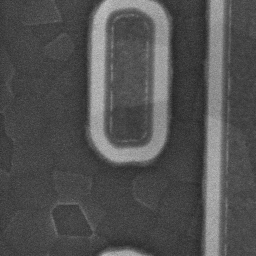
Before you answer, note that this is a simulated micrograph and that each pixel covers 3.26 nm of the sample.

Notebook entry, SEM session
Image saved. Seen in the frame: one or a few lines or trenches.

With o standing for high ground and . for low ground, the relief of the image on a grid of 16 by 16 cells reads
.......oo.....oo
......oooo....oo
......oooo....oo
......oooo....oo
......oooo....oo
......oooo....oo
......oooo...ooo
......oooo...ooo
......oooo...ooo
.......oo....ooo
.............ooo
.............ooo
.............ooo
.............ooo
.............ooo
.............ooo